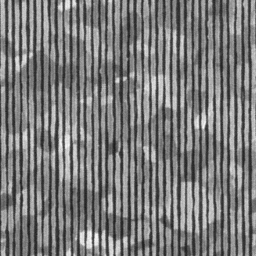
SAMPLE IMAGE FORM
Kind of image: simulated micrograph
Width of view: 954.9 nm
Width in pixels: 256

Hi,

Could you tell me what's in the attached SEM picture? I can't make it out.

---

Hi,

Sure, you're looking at parallel lines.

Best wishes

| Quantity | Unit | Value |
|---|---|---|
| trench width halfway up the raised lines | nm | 12.1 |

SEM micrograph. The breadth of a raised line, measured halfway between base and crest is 0.0154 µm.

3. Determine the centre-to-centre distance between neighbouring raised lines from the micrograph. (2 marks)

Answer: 7.16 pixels